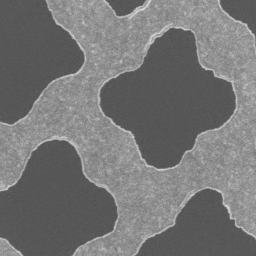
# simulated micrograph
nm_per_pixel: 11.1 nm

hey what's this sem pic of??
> holes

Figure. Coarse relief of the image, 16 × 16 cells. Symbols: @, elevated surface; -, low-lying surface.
---@@@@--@@@@@--
----@@@@@@@@@@@-
-----@@@@@--@@@@
-----@@@@---@@@@
-----@@@-----@@@
---@@@---------@
--@@@@---------@
-@@@@@@-------@@
@@@-@@@@-----@@@
@@---@-@@---@@@@
@@---@-@@@-@@@@@
@------@@@@@@@@@
-------@@@@@--@@
-------@@@@---@@
-------@@@-----@
@----@@@@-------